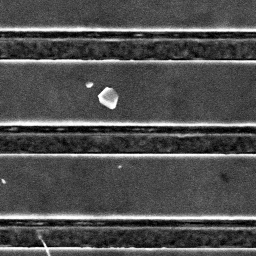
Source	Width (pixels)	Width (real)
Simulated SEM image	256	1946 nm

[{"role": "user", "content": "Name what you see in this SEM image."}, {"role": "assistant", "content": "lines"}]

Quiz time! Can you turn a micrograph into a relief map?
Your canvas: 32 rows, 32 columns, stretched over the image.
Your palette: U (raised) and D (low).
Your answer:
UUUUUUUUUUUUUUUUUUUUUUUUUUUUUUUU
UUUUUUUUUUUUUUUUUUUUUUUUUUUUUUUU
UUUUUUUUUUUUUUUUUUUUUUUUUUUUUUUU
UUUUUUUUUUUUUUUUUUUUUUUUUUUUUUUU
DDDDDDDDDDDDDDDDDDDDDDDDDDDDDDDD
DDDDDDDDDDDDDDDDDDDDDDDDDDDDDDDD
DDDDDDDDDDDDDDDDDDDDDDDDDDDDDDDD
DDDDDDDDDDDDDDDDDDDDDDDDDDDDDDDD
UUUUUUUUUUUUUUUUUUUUUUUUUUUUUUUU
UUUUUUUUUUUUUUUUUUUUUUUUUUUUUUUU
UUUUUUUUUUUUUUUUUUUUUUUUUUUUUUUU
UUUUUUUUUUUUUUUUUUUUUUUUUUUUUUUU
UUUUUUUUUUUUUUUUUUUUUUUUUUUUUUUU
UUUUUUUUUUUUUUUUUUUUUUUUUUUUUUUU
UUUUUUUUUUUUUUUUUUUUUUUUUUUUUUUU
UUUUUUUUUUUUUUUUUUUUUUUUUUUUUUUU
DDDDDDDDDDDDDDDDDDDDDDDDDDDDDDDD
DDDDDDDDDDDDDDDDDDDDDDDDDDDDDDDD
DDDDDDDDDDDDDDDDDDDDDDDDDDDDDDDD
UUUUUUUUUUUUUUUUUUUUUUUUUUUUUUUU
UUUUUUUUUUUUUUUUUUUUUUUUUUUUUUUU
UUUUUUUUUUUUUUUUUUUUUUUUUUUUUUUU
UUUUUUUUUUUUUUUUUUUUUUUUUUUUUUUU
UUUUUUUUUUUUUUUUUUUUUUUUUUUUUUUU
UUUUUUUUUUUUUUUUUUUUUUUUUUUUUUUU
UUUUUUUUUUUUUUUUUUUUUUUUUUUUUUUU
UUUUUUUUUUUUUUUUUUUUUUUUUUUUUUUU
DDDDDDDDDDDDDDDDDDDDDDDDDDDDDDDD
DDDDDDDDDDDDDDDDDDDDDDDDDDDDDDDD
DDDDDDDDDDDDDDDDDDDDDDDDDDDDDDDD
DDDDDDDDDDDDDDDDDDDDDDDDDDDDDDDD
UUUUUUUUUUUUUUUUUUUUUUUUUUUUUUUU